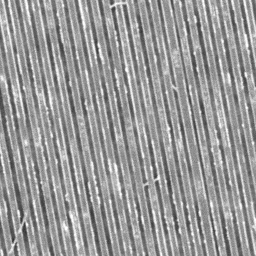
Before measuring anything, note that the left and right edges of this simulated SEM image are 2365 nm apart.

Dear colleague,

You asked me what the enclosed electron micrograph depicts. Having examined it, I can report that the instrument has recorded parallel lines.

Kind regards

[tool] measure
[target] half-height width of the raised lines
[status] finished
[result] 62.4 nm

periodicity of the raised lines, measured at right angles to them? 11.6 pixels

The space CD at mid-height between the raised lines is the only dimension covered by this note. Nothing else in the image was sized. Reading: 46.6 nanometers